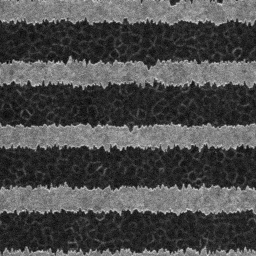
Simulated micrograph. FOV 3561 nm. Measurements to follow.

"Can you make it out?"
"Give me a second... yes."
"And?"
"one or a few lines or trenches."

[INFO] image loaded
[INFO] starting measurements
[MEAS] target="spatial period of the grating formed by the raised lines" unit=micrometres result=0.868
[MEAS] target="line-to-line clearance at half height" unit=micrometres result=0.555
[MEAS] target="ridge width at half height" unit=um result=0.301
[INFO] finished